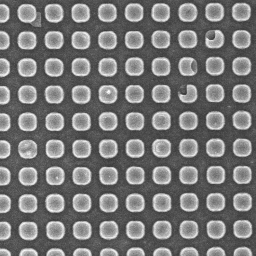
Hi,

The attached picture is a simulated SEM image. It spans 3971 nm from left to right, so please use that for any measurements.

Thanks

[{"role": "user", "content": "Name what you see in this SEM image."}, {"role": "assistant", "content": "a regular array of raised bodies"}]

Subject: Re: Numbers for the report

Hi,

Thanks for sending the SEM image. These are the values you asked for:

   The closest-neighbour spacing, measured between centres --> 0.412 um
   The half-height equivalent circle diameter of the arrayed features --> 282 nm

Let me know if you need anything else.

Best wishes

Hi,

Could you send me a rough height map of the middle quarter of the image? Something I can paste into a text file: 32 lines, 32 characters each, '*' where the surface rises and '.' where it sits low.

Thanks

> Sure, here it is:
..****...****...****..****...***
..****...****...****..****...***
...***....**....***....***....**
................................
................................
...**.....*......**....**......*
..****...****...****..****.....*
..****...****...****..****.....*
..****...****...****..****...***
...***....**.....**....***......
................................
................................
...**.....**.....**....***...***
..****...****...****..*****..***
..****...****...****..*****..***
..****...****...****...***...***
...**...........................
................................
................................
...***...****...***....***...***
..****...****...****..*****..***
..****...****...****..*****..***
...***...****...****...***...***
................................
................................
................................
...***...****...***....***...***
..****...****...****..****...***
...***...****...****..****...***
...***...****...***....***....**
................................
................................